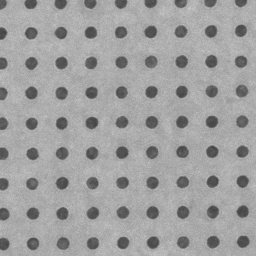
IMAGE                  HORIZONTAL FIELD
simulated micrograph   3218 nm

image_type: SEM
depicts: a regular array of holes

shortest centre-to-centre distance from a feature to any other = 372 nm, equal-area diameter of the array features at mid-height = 0.165 um